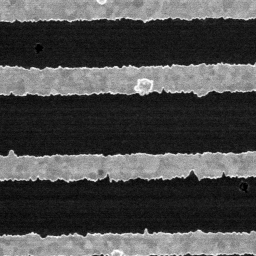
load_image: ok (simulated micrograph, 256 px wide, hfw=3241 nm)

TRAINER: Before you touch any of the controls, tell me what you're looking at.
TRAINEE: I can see one or a few lines or trenches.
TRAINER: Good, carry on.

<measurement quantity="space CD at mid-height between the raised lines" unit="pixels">55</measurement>